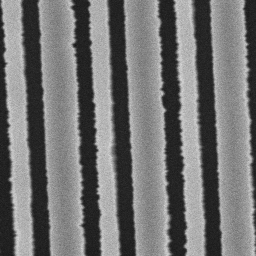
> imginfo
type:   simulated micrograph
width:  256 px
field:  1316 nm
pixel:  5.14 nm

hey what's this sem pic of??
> lines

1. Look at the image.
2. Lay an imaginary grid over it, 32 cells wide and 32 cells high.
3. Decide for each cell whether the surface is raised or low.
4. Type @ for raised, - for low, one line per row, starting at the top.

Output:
@@@--@@@@--@@---@@@@--@@--@@@@@-
@@@--@@@@--@@@--@@@@--@@--@@@@--
@@@--@@@@--@@@--@@@@--@@--@@@@@-
@@@--@@@@--@@@--@@@@--@@--@@@@@-
-@@--@@@@--@@@--@@@@--@@--@@@@@-
-@@--@@@@--@@@--@@@@--@@---@@@@-
-@@--@@@@--@@@--@@@@--@@@--@@@@-
-@@--@@@@@-@@@--@@@@--@@---@@@@-
-@@--@@@@@-@@@--@@@@--@@@--@@@@-
-@@--@@@@@--@@--@@@@--@@@--@@@@-
-@@--@@@@@--@@--@@@@--@@@--@@@@-
-@@--@@@@@--@@--@@@@--@@@--@@@@-
-@@--@@@@@--@@--@@@@--@@@--@@@@-
-@@--@@@@@--@@--@@@@@--@@--@@@@-
-@@---@@@@--@@--@@@@@-@@@--@@@@-
-@@---@@@@--@@--@@@@@--@@--@@@@-
-@@---@@@@--@@--@@@@@--@@--@@@@-
-@@---@@@@--@@--@@@@@--@@--@@@@-
-@@@--@@@@--@@--@@@@@--@@--@@@@-
-@@@--@@@@--@@--@@@@@--@@--@@@@@
-@@@--@@@@--@@---@@@@--@@--@@@@-
-@@@--@@@@--@@--@@@@@--@@--@@@@-
-@@@--@@@@--@@---@@@@--@@--@@@@@
-@@@--@@@@--@@@--@@@@--@@--@@@@@
-@@@--@@@@--@@@--@@@@--@@--@@@@@
--@@--@@@@--@@@--@@@@--@@--@@@@@
--@@--@@@@---@@--@@@@--@@--@@@@@
--@@--@@@@--@@@--@@@@--@@@--@@@@
--@@--@@@@--@@@--@@@@--@@@-@@@@@
--@@--@@@@@--@@--@@@@--@@@--@@@@
--@@--@@@@@--@@--@@@@--@@@--@@@@
--@@--@@@@@--@@--@@@@--@@@--@@@@